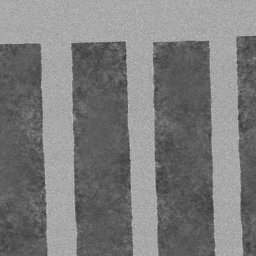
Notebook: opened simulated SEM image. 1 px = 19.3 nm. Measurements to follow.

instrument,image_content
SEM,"one or a few lines or trenches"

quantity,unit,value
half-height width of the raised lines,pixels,26.5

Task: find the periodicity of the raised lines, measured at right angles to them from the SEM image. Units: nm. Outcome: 1610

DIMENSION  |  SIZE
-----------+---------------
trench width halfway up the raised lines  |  1110 nm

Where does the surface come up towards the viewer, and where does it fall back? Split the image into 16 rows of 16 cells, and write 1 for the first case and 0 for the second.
1111111111111111
1111111111111111
1111111111111110
0001000011000110
0001000011000110
0001000011000110
0001100011000110
0001100011000110
0001100011000110
0001100011000110
0001100011000110
0001100011000110
0001100011000110
0001100011000110
0001100011000110
0001100011000110